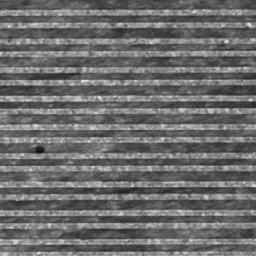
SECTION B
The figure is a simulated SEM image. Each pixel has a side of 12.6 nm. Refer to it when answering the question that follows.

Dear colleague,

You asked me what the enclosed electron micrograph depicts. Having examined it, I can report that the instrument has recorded parallel lines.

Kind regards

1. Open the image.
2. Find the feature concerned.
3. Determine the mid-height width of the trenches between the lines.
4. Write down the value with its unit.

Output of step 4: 8.13 pixels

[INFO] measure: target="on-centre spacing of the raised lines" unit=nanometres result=180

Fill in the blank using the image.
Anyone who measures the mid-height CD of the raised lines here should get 67.7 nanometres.